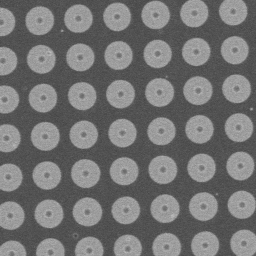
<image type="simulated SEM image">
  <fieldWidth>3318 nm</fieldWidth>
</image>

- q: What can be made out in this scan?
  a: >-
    an array of small figures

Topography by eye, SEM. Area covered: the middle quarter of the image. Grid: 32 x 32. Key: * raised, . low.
.******....*****.....****.......
...**...........................
................................
................................
............****.....*****.....*
..*****....******....******...**
.*******...******...*******...**
.*******...******...*******...**
.*******...*******...******...**
.*******...******....*****.....*
..*****.....****.......**.......
................................
................................
........................*.......
....**......*****.....*****....*
..******....*****....******...**
..******...*******...*******..**
.*******...*******...*******...*
..******...*******...******....*
..******....*****.....****......
...****......***................
................................
................................
..............**.......****.....
...****.....******....******...*
..******....******...*******...*
..*******...******...*******...*
..*******...******...*******...*
..*******...******....******....
...*****.....****......***......
....***.........................
................................